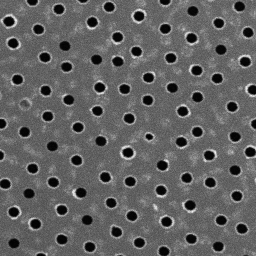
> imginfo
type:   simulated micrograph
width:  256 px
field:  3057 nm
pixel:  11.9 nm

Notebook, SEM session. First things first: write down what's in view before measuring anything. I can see a regular array of holes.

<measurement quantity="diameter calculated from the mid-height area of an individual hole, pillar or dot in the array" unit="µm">0.128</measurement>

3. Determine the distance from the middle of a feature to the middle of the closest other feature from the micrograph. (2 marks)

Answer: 25.3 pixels